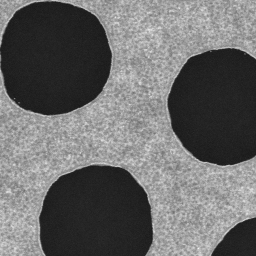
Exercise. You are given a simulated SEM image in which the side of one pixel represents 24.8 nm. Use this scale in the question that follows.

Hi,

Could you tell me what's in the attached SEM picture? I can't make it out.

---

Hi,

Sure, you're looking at holes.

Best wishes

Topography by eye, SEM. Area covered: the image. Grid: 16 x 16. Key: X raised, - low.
X----XXXXXXXXXXX
------XXXXXXXXXX
-------XXXXXXXXX
-------XXXXX----
-------XXXX-----
------XXXXX-----
X----XXXXX------
XXXXXXXXXXX-----
XXXXXXXXXXX-----
XXXXXXXXXXXX----
XXXXX---XXXXXXXX
XXX------XXXXXXX
XXX------XXXXXXX
XX-------XXXXXXX
XX--------XXXX--
XXX------XXXX---